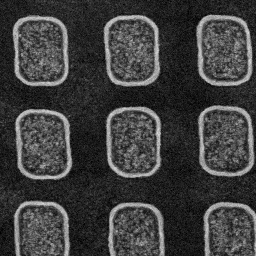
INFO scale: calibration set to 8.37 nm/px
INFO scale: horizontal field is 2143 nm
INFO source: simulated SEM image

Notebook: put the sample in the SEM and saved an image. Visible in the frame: raised bodies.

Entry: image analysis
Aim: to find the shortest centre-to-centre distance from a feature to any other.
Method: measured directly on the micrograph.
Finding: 759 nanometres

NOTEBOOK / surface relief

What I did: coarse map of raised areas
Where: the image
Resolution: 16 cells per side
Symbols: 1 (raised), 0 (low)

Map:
0000000000000000
0111000110000110
0111000111001111
0111000111000111
0111000111000111
0000000000000000
0000000000000000
0111000111000111
0111000111000111
0111000111000111
0111000111000110
0000000000000000
0000000000000000
0111000111000111
0111000111000111
0111000111000111